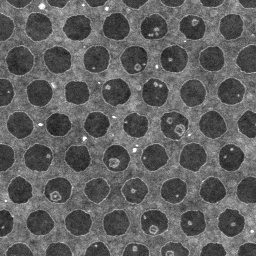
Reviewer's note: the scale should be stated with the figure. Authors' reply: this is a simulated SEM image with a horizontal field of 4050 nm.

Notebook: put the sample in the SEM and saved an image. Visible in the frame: a regular array of raised bodies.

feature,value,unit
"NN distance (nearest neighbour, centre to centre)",591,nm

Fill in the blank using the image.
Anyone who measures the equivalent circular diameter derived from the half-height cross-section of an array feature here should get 439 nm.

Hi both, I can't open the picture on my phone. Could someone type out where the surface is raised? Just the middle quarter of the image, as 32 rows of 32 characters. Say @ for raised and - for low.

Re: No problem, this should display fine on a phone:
@@---@@@@@@----@@@@@@---@@@@@@@-
@-----@@@@-----@@@@@-----@@@@@--
-----------------@--------------
--------------------------------
-@@@@-----@@@@@------@@@@-----@@
@@@@@@----@@@@@@----@@@@@@---@@@
@@@@@@---@@@@@@@@--@@@@@@@---@@@
@@@@@@---@@@@@@@@--@@@@@@@---@@@
@@@@@@----@@@@@@---@@@@@@@---@@@
-@@@@@----@@@@@@----@@@@@-----@@
------------@--------@@@-------@
--------------------------------
------@@@@------@@@------@@@@---
@----@@@@@@----@@@@@@---@@@@@@@-
@@---@@@@@@----@@@@@@---@@@@@@@-
@@---@@@@@@----@@@@@@---@@@@@@@-
@@---@@@@@@----@@@@@@---@@@@@@@-
@-----@@@@------@@@@-----@@@@@--
--------@---------@-------@@@---
--------------------------------
--@@@-------@@-------@@@@-----@@
-@@@@@----@@@@@@----@@@@@----@@@
@@@@@@----@@@@@@----@@@@@@---@@@
@@@@@@@---@@@@@@@--@@@@@@@---@@@
@@@@@@@---@@@@@@---@@@@@@@---@@@
-@@@@@----@@@@@@----@@@@@----@@@
--@@@------@@@@------@@--------@
--------------------------------
------------------@--------@@---
@-----@@@@@----@@@@@-----@@@@@--
@@---@@@@@@----@@@@@@---@@@@@@@-
@@---@@@@@@---@@@@@@@---@@@@@@@-